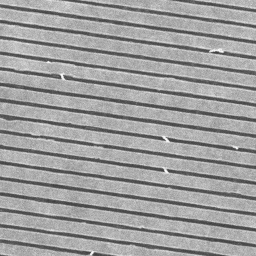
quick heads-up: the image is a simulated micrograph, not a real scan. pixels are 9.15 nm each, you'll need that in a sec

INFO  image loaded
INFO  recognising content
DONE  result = parallel lines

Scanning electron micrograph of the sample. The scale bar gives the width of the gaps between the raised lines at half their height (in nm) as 39.7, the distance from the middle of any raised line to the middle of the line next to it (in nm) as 142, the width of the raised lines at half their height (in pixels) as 11.1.